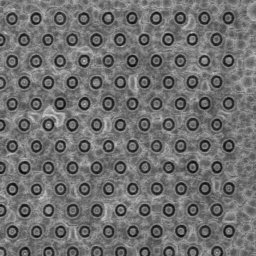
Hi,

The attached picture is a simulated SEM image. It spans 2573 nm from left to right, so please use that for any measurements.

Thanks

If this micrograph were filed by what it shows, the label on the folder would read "a regular array of ring-shaped grooves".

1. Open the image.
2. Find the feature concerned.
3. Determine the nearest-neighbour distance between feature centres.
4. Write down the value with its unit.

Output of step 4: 239 nm